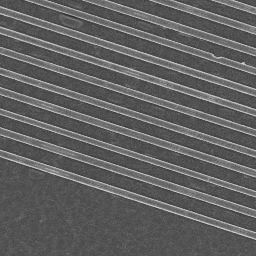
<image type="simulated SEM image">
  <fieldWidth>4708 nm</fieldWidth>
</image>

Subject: parallel lines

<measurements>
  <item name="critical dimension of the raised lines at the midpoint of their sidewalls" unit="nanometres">131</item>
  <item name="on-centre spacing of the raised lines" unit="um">0.358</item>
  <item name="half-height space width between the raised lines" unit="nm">230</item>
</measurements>